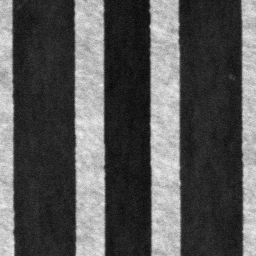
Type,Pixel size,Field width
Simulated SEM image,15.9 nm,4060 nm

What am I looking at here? lines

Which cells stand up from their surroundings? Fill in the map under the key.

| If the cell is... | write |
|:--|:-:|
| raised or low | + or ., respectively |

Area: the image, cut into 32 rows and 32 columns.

+........++++......+++........++
+........++++......+++........++
+........++++......+++........++
+........++++......+++........++
+........++++......+++........++
+........++++......+++........++
+........++++......+++........++
+........++++......+++........++
+........++++......+++........++
++.......++++......+++........++
++.......++++......+++........++
++.......++++......+++........++
++.......++++......+++........++
++.......++++......+++........++
++.......++++......+++........++
++.......++++......+++........++
++.......++++......+++........++
++........+++......+++........++
++.......++++......+++........++
++.......++++......+++........++
++.......++++......+++........++
++........+++......+++........++
++........+++......+++........++
++........+++......+++........++
++........+++......+++........++
++........+++......+++........++
++........+++......+++........++
++........+++......+++........++
++........+++......+++........++
++........+++......+++........++
++........+++......+++........++
++........+++......+++........++